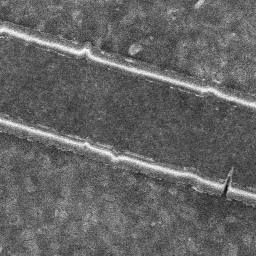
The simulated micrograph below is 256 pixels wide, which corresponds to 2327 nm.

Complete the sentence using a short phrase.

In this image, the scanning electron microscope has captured one or a few lines or trenches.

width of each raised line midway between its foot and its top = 795 nanometres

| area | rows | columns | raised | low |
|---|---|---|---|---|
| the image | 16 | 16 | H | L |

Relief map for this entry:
LLLLLLLLLLLLLLLL
LLLLLLLLLLLLLLLL
HHLLLLLLLLLLLLLL
HHHHHHLLLLLLLLLL
HHHHHHHHHLLLLLLL
HHHHHHHHHHHHLLLL
HHHHHHHHHHHHHHHH
HHHHHHHHHHHHHHHH
LLLHHHHHHHHHHHHH
LLLLLLLHHHHHHHHH
LLLLLLLLLLHHHHHH
LLLLLLLLLLLLLHHH
LLLLLLLLLLLLLLLL
LLLLLLLLLLLLLLLL
LLLLLLLLLLLLLLLL
LLLLLLLLLLLLLLLL